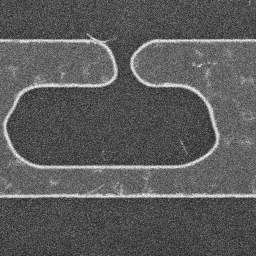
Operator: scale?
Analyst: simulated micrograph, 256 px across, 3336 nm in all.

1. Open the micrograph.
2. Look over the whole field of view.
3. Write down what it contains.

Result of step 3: one or a few lines or trenches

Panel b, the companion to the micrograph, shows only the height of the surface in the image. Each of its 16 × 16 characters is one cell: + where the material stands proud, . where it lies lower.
................
................
................
+++++++.++++++++
+++++++.++++++++
++..........++++
+............+++
.............+++
..............++
+............+++
+++.++++++++++++
++++++++++++++++
................
................
................
................